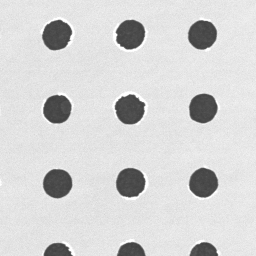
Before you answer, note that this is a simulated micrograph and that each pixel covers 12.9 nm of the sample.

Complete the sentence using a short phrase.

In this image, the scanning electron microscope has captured a regular array of holes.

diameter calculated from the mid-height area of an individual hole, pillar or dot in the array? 380 nanometres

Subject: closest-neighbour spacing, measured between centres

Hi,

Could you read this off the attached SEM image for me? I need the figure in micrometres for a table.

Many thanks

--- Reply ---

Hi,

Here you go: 0.94